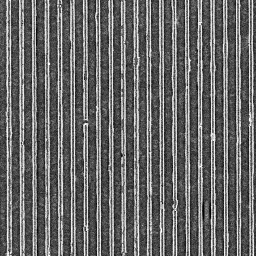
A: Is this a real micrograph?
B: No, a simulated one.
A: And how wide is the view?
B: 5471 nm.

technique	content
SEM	parallel lines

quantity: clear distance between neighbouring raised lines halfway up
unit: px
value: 9.75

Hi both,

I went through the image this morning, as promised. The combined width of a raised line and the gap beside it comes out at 272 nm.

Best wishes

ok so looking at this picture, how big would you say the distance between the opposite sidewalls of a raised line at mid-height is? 3 pixels